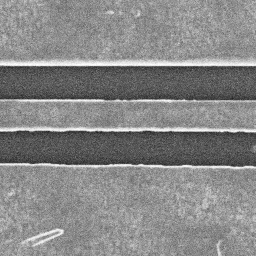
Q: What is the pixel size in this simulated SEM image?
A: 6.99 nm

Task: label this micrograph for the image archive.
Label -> lines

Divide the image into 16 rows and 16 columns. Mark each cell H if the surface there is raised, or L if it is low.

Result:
HHHHHHHHHHHHHHHH
HHHHHHHHHHHHHHHH
HHHHHHHHHHHHHHHH
HHHHHHHHHHHHHHHH
LLLLLLLLLLLLLLLL
LLLLLLLLLLLLLLLL
HHHHHHHHHHHHHHHH
HHHHHHHHHHHHHHHH
LLLLLLLLLLLLLLLL
LLLLLLLLLLLLLLLL
HHHHHHHHHHHHHHHH
HHHHHHHHHHHHHHHH
HHHHHHHHHHHHHHHH
HHHHHHHHHHHHHHHH
HHHHHHHHHHHHHHHH
HHHHHHHHHHHHHHHH